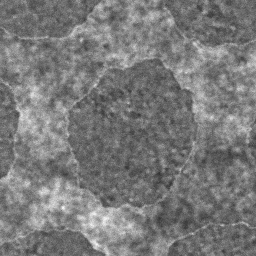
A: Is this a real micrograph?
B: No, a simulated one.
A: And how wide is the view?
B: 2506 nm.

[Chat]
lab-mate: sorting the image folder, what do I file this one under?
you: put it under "raised bodies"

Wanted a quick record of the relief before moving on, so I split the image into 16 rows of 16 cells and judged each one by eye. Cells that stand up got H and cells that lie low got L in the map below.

HHHHHHLLLLHHHHHH
HHHHHLLLLLLHHHHH
LLLLLLLLLLLLHHHH
LLLLLLLLLLLLLLLL
LLLLLLLHHHHLLLLL
HLLLLLHHHHHHLLLL
HLLLLHHHHHHHLLLL
HLLLHHHHHHHHLLLL
HLLLHHHHHHHHLLLH
HLLLHHHHHHHHLLLL
HLLLLHHHHHHLLLLL
LLLLLHHHHHHLLLLL
LLLLLLHHHHLLLLLL
LLLLLLLLLLLLLLLL
LLHHHLLLLLLLHHHH
HHHHHHLLLLLHHHHH